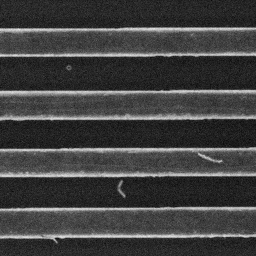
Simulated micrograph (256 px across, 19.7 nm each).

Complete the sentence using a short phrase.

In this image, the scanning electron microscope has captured lines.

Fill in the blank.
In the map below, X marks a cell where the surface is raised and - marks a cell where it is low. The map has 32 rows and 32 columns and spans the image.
--------------------------------
--------------------------------
--------------------------------
--------------------------------
XXXXXXXXXXXXXXXXXXXXXXXXXXXXXXXX
XXXXXXXXXXXXXXXXXXXXXXXXXXXXXXXX
XXXXXXXXXXXXXXXXXXXXXXXXXXXXXXXX
--------------------------------
--------------------------------
--------------------------------
--------------------------------
----XXXXXXXXXXXXXXXXXXXXXXXXXXXX
XXXXXXXXXXXXXXXXXXXXXXXXXXXXXXXX
XXXXXXXXXXXXXXXXXXXXXXXXXXXXXXXX
XXXXXXXXXXXXXXXXXXXXXXXXXXXXXXXX
--------------------------------
--------------------------------
--------------------------------
--------------------------------
XXXXXXXXXXXXXXXXXXXXXXXXXXXXXXXX
XXXXXXXXXXXXXXXXXXXXXXXXXXXXXXXX
XXXXXXXXXXXXXXXXXXXXXXXXXXXXXXXX
--------------------------------
--------------------------------
--------------------------------
--------------------------------
XXXXXXXXXXXXXXXXXXXXXXXXXXXXXXXX
XXXXXXXXXXXXXXXXXXXXXXXXXXXXXXXX
XXXXXXXXXXXXXXXXXXXXXXXXXXXXXXXX
XXXXXXXXXXXXXXXXXXXXXXXXXXXXXXXX
--------------------------------
--------------------------------